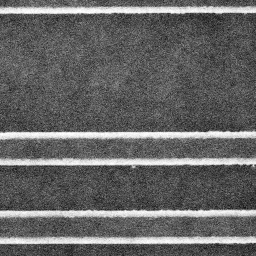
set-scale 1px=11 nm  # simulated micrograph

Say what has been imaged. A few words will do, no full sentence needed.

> lines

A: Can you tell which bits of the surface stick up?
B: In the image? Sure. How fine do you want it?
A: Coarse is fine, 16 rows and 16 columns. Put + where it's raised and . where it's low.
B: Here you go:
++++++++++++++++
................
................
................
................
................
................
................
++++++++++++++++
++++++++++++++++
................
................
................
++++++++++++++++
++++++++++++++++
................